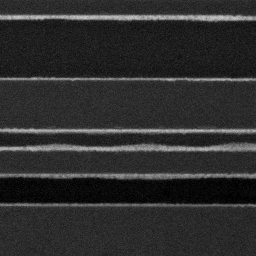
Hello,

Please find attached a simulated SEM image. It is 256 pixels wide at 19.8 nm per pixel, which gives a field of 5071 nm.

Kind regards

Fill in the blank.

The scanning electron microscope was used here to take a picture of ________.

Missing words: lines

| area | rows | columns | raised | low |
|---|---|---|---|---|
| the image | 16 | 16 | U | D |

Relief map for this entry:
UUUUUUUUUUUUUUUU
DDDDDDDDDDDDDDDD
DDDDDDDDDDDDDDDD
DDDDDDDDDDDDDDDD
DDDDDDDDDDDDDDDD
UUUUUUUUUUUUUUUU
UUUUUUUUUUUUUUUU
UUUUUUUUUUUUUUUU
UUUUUUUUUUUUUUUU
UUUUUUUUUUUUUUUU
UUUUUUUUUUUUUUUU
DDDDDDDDDDDDDDDD
DDDDDDDDDDDDDDDD
UUUUUUUUUUUUUUUU
UUUUUUUUUUUUUUUU
UUUUUUUUUUUUUUUU